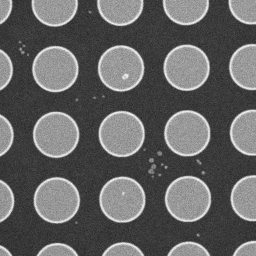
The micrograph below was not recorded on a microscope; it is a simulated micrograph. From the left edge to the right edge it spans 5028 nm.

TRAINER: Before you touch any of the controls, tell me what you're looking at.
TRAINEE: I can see an array of small figures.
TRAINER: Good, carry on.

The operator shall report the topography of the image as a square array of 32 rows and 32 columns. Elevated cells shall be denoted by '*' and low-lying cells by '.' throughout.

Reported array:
*...******..******..******...***
*...*****...******...*****...***
*....****....****....****.....**
................................
................................
................................
*....****....****....****....***
*...******...*****...*****...***
**..******..******...*****...***
*...******..******...*****...***
*....****....****....****.....**
................................
................................
................................
.....****....****.....***.....**
*....****....*****...*****...***
**..******..******...*****...***
**..******..******...*****...***
*....****....****....*****....**
......**......**................
................................
................................
......**......***.....***.....**
*....****....*****...*****...***
**..******..******...*****...***
**..******..******...*****...***
*....*****...*****...*****...***
......**......***.....***......*
................................
................................
.......*......**......***.....**
*....****....*****...*****...***